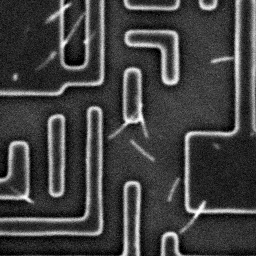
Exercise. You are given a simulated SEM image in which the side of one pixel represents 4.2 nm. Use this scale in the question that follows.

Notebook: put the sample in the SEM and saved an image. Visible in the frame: wiring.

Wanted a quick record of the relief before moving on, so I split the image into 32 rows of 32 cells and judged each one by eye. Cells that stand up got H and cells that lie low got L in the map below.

HHHHHHHHLLLHHLLLHHHHHHLLLHHLLLHH
HHHHHHHHLLLHHLLLLLLLLLLLLLLLLLHH
HHHHHHHHLLLHHLLLLLLLLLLLLLLLLLHH
HHHHHHHHLLLHHLLLLLLLLLLLLLLLLLHH
HHHHHHHHLLLHHLLLHHHHHHLLLLLLLLHH
HHHHHHHHLLLHHLLLHHHHHHLLLLLLLLHH
HHHHHHHHLLLHHLLLLLLLHHLLLLLLLLHH
HHHHHHHHLLLHHLLLLLLLHHLLLLLLLLHH
HHHHHHHHHHHHHLLLLLLLHHLLLLLLLLHH
HHHHHHHHHHHHHLLLHHLLHHLLLLLLLLHH
HHHHHHHHHHHHLLLLHHLLLLLLLLLLLLHH
HHHHHHHHLLLLLLLLHHLLLLLLLLLLLLHH
LLLLLLLLLLLLLLLLHHLLLLLLLLLLLLHH
LLLLLLLLLLLHLLLLHHLLLLLLLLLLLLHH
LLLLLLLHLLLHHLLLHHLLLLLLLLLLLLHH
LLLLLLHHLLLHHLLLLLLLLLLLLLLLLLHH
LLLLLLHHLLLHHLLLLLLLLLLLLLLLLHHH
LLLLLLHHLLLHHLLLLLLLLLLHHHHHHHHH
LHHLLLHHLLLHHLLLLLLLLLLHHHHHHHHH
LHHHLLHHLLLHHLLLLLLLLLLHHHHHHHHH
LHHHLLHHLLLHHLLLLLLLLLLHHHHHHHHH
LHHHLLHHLLLHHLLLLLLLLLLHHHHHHHHH
HHHHLLHHLLLHHLLLLLLLLLLHHHHHHHHH
HHHHLLHHLLLHHLLLHLLLLLLHHHHHHHHH
HHHLLLLLLLLHHLLLHLLLLLLHHHHHHHHH
LLLLLLLLLLLHHLLLHLLLLLLHHHHHHHHH
LLLLLLLLLLLHHLLLHLLLLLLLHHHHLHHH
HHHHHHHHHHHHHLLLHLLLLLLLLLLLLLLL
HHHHHHHHHHHHHLLLHLLLLLLLLLLLLLLL
LLLLLLLLLLLLLLLLHLLLLHLLLLLLLLLL
LLLLLLLLLLLLLLLLHLLLHHLLLLLLLLLL
LLLLLLLLLLLLLLLHHLLLHHLLLLLLLLLL